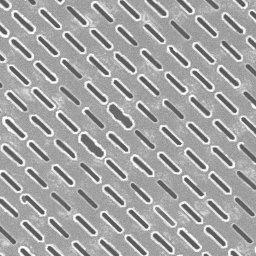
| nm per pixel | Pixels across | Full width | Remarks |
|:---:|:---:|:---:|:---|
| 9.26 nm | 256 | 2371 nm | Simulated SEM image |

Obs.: a regular array of holes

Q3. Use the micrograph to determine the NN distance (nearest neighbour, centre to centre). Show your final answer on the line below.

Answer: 244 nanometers